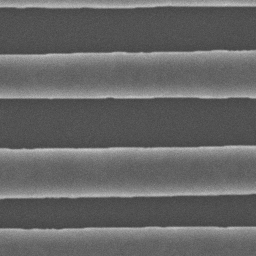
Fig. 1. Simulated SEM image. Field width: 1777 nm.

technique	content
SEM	lines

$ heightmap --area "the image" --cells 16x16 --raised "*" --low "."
................
................
................
****************
****************
****************
................
................
................
****************
****************
****************
................
................
****************
****************